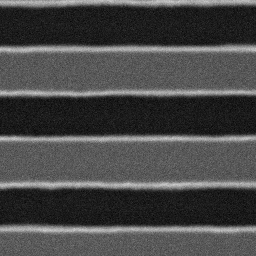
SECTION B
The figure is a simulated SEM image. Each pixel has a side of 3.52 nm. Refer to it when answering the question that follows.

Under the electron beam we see lines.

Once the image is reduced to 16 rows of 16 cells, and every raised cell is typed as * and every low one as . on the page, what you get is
................
................
................
****************
****************
****************
................
................
................
****************
****************
*************.**
................
................
****************
****************